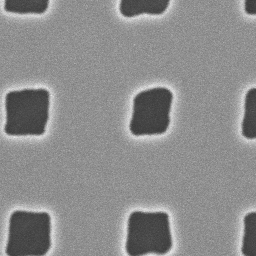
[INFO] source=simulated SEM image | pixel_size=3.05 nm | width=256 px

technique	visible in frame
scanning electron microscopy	holes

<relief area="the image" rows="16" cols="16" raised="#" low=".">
...#####..#####.
################
################
################
################
################
...#####...####.
...#####...####.
###############.
################
################
################
################
#..#####..#####.
#..#####...####.
...#####...####.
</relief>